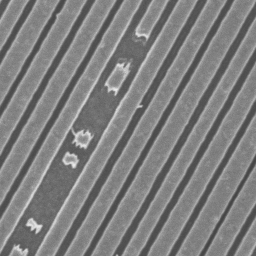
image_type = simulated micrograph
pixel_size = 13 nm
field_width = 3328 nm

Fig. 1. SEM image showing parallel lines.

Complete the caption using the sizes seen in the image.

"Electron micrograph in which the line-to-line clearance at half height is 97.8 nm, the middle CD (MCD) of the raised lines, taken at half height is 0.218 microns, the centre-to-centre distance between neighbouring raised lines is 0.319 microns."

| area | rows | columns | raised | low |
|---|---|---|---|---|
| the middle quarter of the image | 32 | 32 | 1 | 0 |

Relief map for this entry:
11110011110001100001111100011110
11100111110001110001111100111110
11100111100011110011111000111100
11001111100111100011111001111100
10001111000111100111110001111001
10011110000111000111100011110001
00111110000101001111100011110011
00111100000000001111000111100111
01111100000000011111001111100111
01111000000000111110001111001111
11111000000000111110011111001111
11110000000001111100011110011111
11100000000001111000111110011111
11100000000011111001111100111110
11000000000011110001111000111110
11000000000111110011111001111100
10000000000111100011110001111100
10011100001111100111110011111000
00011110011111000111100111111001
00011100011110001111100111110001
00001100111110001111001111110011
00000000111100011111011111100111
00000001111100011110011111000111
11100001111000111110011111001111
11100011111001111100111110001111
00100111110001111001111110011110
00000111100011111001111100111110
00001111100011110011111000111100
00001111000111110011111001111100
00011111000111100111110001111001
00011110001111000111110011110001
00111110011111001111100011110011